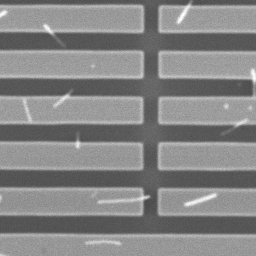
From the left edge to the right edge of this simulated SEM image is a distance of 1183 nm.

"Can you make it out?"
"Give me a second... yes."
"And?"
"groups of lines, slits or small figures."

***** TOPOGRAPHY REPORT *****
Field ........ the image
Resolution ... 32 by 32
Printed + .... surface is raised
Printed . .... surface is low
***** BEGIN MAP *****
................................
++++++++++++++++++..++++++++++++
++++++++++++++++++..++++++++++++
++++++++++++++++++..++++++++++++
................................
................................
++++++++++++++++++..++++........
++++++++++++++++++..++++++++++++
++++++++++++++++++..++++++++++++
++++++++++++++++++..++++++++++++
................................
................................
++++++++++++++++++..++++++++++++
++++++++++++++++++..++++++++++++
++++++++++++++++++..++++++++++++
....+++.............++++++++++++
................................
................................
++++++++++++++++++..++++++++++++
++++++++++++++++++..++++++++++++
++++++++++++++++++..++++++++++++
................................
................................
+++....++++...++................
++++++++++++++++++..++++++++++++
++++++++++++++++++..++++++++++++
++++++++++++++++++..++++++++++++
................................
................................
++++++++++++++++++++++++++++++++
++++++++++++++++++++++++++++++++
++++++++++++++++++++++++++++++++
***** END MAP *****